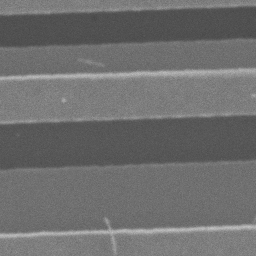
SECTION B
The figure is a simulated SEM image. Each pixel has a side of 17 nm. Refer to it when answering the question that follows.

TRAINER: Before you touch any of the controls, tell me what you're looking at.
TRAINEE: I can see lines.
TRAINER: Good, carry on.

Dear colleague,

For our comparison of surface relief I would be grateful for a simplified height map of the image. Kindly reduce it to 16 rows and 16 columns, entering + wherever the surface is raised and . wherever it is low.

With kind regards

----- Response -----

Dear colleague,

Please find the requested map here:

+++++++++++.....
................
..............++
++++++++++++++++
++++++++++++++++
++++++++++++++++
++++++++++++++++
++++++..........
................
................
....++++++++++++
++++++++++++++++
++++++++++++++++
++++++++++++++++
++++++++++++++++
++++++++++++++++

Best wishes